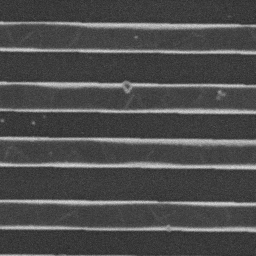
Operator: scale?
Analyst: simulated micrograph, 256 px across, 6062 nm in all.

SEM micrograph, lines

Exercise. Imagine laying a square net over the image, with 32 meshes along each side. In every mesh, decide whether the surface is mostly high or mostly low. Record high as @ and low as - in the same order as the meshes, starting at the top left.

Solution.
--------------------------------
--------------------------------
--------------------------------
@@@@@@@@@@@@@@@@@@@@@@@@@@@@@@@@
@@@@@@@@@@@@@@@@@@@@@@@@@@@@@@@@
@@@@@@@@@@@@@@@@@@@@@@@@@@@@@@@@
------------------------------@@
--------------------------------
--------------------------------
--------------------------------
@@@@@@@--------@@---------------
@@@@@@@@@@@@@@@@@@@@@@@@@@@@@@@@
@@@@@@@@@@@@@@@@@@@@@@@@@@@@@@@@
@@@@@@@@@@@@@@@@@@@@@@@@@@@@@@@@
--------------------------------
--------------------------------
--------------------------------
@@@@@@@@@@@@@@------------------
@@@@@@@@@@@@@@@@@@@@@@@@@@@@@@@@
@@@@@@@@@@@@@@@@@@@@@@@@@@@@@@@@
@@@@@@@@@@@@@@@@@@@@@@@@@@@@@@@@
--------------------------------
--------------------------------
--------------------------------
--------------------------------
@@@@@@@@@@@@@@@@@@@@@@@@@@@-----
@@@@@@@@@@@@@@@@@@@@@@@@@@@@@@@@
@@@@@@@@@@@@@@@@@@@@@@@@@@@@@@@@
---------@@@@@@@@@@@@@@@@@@@@@@@
--------------------------------
--------------------------------
--------------------------------